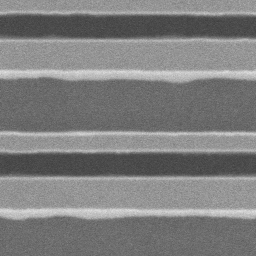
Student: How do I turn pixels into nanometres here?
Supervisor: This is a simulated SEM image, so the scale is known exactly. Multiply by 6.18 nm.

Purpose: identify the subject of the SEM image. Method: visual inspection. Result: lines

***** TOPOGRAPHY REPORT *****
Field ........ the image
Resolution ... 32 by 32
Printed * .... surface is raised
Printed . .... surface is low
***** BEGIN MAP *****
********************************
********************************
................................
................................
................................
********************************
********************************
********************************
********************************
................................
................................
................................
................................
................................
................................
................................
................................
********************************
********************************
................................
................................
................................
********************************
********************************
********************************
********************************
*******..***********************
................................
................................
................................
................................
................................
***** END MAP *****